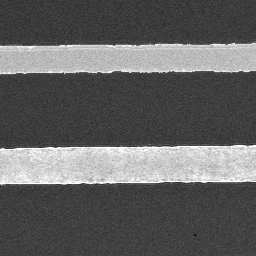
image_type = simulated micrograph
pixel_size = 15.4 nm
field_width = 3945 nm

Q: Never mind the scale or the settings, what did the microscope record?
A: lines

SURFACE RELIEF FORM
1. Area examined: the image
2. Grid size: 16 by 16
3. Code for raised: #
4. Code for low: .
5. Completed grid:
................
................
................
................
................
................
................
................
................
################
################
................
................
................
................
................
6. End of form